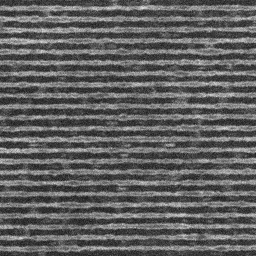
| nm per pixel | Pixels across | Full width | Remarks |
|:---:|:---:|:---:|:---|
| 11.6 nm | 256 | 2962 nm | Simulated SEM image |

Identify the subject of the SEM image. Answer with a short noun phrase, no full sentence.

parallel lines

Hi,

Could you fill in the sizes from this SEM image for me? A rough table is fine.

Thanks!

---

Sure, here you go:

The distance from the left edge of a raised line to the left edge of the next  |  126 nm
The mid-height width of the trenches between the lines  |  7.75 pixels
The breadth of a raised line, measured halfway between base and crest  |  30.4 nm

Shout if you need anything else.